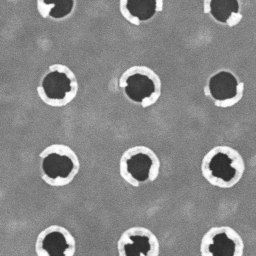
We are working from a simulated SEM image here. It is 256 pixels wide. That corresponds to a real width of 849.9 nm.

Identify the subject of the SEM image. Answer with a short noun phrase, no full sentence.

holes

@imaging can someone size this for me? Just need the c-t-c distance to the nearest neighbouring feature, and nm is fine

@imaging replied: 268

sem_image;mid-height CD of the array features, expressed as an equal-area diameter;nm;93.7